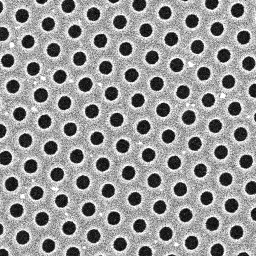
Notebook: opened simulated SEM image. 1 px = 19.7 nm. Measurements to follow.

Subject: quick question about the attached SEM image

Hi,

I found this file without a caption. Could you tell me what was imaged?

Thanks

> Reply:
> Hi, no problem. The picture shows a regular array of holes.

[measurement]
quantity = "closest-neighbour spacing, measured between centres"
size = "26.4 pixels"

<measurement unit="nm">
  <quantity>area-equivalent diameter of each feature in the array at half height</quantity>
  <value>283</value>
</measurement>